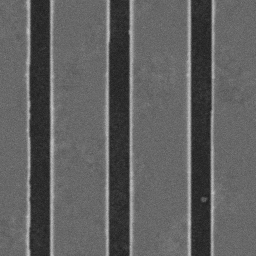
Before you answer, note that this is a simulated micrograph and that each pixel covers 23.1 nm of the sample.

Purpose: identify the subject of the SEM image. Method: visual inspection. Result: lines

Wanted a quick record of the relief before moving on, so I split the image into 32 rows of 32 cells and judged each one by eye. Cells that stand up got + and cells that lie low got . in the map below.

++++..++++++++..++++++++...+++++
++++..++++++++..++++++++...+++++
++++..++++++++..++++++++...+++++
++++..++++++++..++++++++...+++++
++++..++++++++..++++++++...+++++
++++..++++++++..++++++++...+++++
++++..++++++++..++++++++...+++++
++++..++++++++..++++++++...+++++
++++..++++++++..++++++++...+++++
++++..++++++++..++++++++...+++++
++++..++++++++..++++++++...+++++
++++..++++++++..++++++++...+++++
++++..++++++++..++++++++...+++++
++++..++++++++..++++++++...+++++
++++..++++++++..++++++++...+++++
++++..++++++++..++++++++...+++++
++++..++++++++..++++++++...+++++
++++..++++++++..++++++++..++++++
++++..++++++++..++++++++...+++++
++++..++++++++..++++++++...+++++
++++..++++++++..++++++++...+++++
++++..++++++++..++++++++...+++++
++++..++++++++..++++++++...+++++
++++..++++++++..++++++++...+++++
++++..+++++++...++++++++...+++++
++++..++++++++..++++++++...+++++
++++..++++++++..++++++++..++++++
++++..++++++++..++++++++..++++++
++++..+++++++...++++++++..++++++
++++..+++++++...++++++++..++++++
++++..++++++++..++++++++..++++++
++++..++++++++..++++++++..++++++